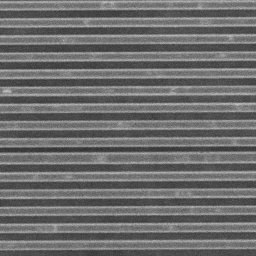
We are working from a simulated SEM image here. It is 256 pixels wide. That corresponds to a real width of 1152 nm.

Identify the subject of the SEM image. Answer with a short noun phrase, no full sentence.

parallel lines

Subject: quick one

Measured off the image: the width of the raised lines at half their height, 0.0416 microns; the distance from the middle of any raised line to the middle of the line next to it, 77.1 nanometres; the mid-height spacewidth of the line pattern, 37.7 nm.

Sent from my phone